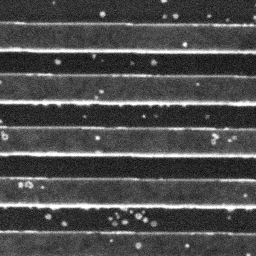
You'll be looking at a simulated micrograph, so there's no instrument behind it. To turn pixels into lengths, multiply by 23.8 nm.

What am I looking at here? lines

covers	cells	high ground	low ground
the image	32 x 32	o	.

................................
................................
................................
oooooooooooooooooooooooooooooooo
oooooooooooooooooooooooooooooooo
oooooooooooooooooooooooooooooooo
..................oooooooooooooo
................................
................................
oooooooooooooooooooo............
oooooooooooooooooooooooooooooooo
oooooooooooooooooooooooooooooooo
oooooooooooooooooooooooooooooooo
................................
................................
................................
oooooooooooooooooooooooooooooooo
oooooooooooooooooooooooooooooooo
oooooooooooooooooooooooooooooooo
.................ooooooooooooooo
................................
................................
oooooooooooooooooo..............
oooooooooooooooooooooooooooooooo
oooooooooooooooooooooooooooooooo
oooooooooooooooooooooooooooooooo
................................
................................
................................
oooooooooooooooooooooooooooooooo
oooooooooooooooooooooooooooooooo
oooooooooooooooooooooooooooooooo